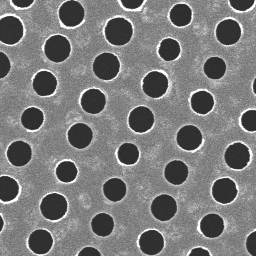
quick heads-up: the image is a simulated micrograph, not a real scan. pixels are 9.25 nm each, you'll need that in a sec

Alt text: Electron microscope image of a regular array of holes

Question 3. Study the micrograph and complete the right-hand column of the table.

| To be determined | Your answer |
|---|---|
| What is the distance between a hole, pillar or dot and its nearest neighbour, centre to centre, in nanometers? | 343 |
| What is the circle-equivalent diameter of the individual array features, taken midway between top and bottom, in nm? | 234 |